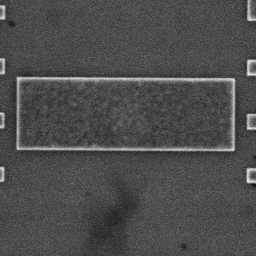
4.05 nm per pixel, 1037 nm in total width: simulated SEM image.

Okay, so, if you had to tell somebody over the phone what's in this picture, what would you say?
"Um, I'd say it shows wiring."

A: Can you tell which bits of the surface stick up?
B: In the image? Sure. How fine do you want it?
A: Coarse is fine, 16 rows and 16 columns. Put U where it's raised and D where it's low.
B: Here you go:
DDDDDDDDDDDDDDDD
DDDDDDDDDDDDDDDD
DDDDDDDDDDDDDDDD
DDDDDDDDDDDDDDDD
DDDDDDDDDDDDDDDD
DUUUUUUUUUUUUUUD
DUUUUUUUUUUUUUUD
DUUUUUUUUUUUUUUD
DUUUUUUUUUUUUUUD
DDDDDDDDDDDDDDDD
DDDDDDDDDDDDDDDD
DDDDDDDDDDDDDDDD
DDDDDDDDDDDDDDDD
DDDDDDDDDDDDDDDD
DDDDDDDDDDDDDDDD
DDDDDDDDDDDDDDDD